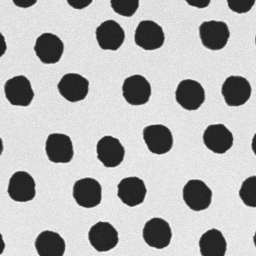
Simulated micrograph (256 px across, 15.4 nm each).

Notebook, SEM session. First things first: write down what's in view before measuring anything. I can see a regular array of holes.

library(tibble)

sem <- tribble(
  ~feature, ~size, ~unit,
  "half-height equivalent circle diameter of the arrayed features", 458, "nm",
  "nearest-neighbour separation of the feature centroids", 729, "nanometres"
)